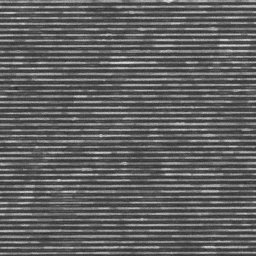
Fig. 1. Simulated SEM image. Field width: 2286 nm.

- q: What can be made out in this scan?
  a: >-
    parallel lines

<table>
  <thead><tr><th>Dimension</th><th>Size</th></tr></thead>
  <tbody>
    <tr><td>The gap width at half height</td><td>35.7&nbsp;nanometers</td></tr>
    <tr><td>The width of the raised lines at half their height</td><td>13.4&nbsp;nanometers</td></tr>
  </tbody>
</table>